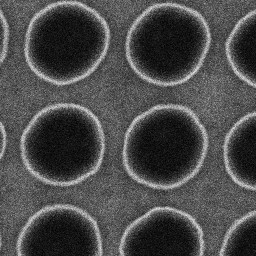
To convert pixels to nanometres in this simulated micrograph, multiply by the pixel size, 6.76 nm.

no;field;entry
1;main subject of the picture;raised bodies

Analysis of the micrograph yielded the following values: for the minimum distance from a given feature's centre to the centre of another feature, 688 nm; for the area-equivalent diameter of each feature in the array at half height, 81.3 px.